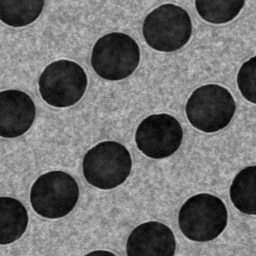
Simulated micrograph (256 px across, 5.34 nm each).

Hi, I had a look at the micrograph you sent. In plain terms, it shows a regular array of holes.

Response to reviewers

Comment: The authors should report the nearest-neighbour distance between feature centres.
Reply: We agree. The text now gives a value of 316 nm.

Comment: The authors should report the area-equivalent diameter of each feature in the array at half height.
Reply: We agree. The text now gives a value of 263 nm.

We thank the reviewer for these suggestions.